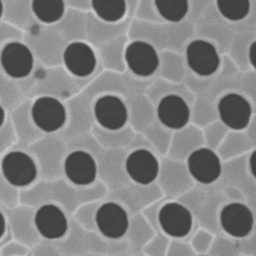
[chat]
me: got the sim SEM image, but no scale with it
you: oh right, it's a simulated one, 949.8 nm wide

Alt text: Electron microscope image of a regular array of holes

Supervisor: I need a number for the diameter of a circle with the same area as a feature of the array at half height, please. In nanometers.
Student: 123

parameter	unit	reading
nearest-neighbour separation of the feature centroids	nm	227